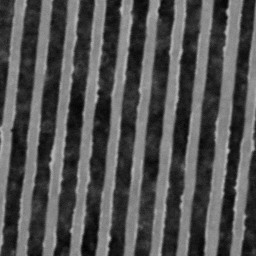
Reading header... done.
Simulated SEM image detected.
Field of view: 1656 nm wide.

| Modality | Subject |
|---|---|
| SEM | parallel lines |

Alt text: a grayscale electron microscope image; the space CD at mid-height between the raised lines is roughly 102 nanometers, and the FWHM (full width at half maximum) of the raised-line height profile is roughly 68.4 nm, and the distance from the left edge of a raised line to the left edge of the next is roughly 173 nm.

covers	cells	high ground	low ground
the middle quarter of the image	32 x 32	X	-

XX----XXX----XXX----XX----XXX---
XXX---XXX----XX-----XX----XXX---
XX----XXX----XX----XXX----XXX---
XX----XXX----XX----XXX----XXX---
XX----XX-----XX----XXX----XXX---
XX----XXX---XXX----XXX----XXX---
XX----XX----XXX----XX-----XXX---
X----XXX----XXX----XX-----XX----
X----XXX----XXX----XX-----XXX---
X----XXX----XX-----XX-----XX----
X----XXX----XX----XXX----XXX----
X----XXX----XX----XXX----XXX----
X----XXX----XX----XXX----XXX----
X----XX-----XX----XXX----XX-----
X----XX-----XX----XXX----XX-----
-----XX-----XX----XX-----XX-----
X----XX-----XX----XX-----XX----X
X----XX----XXX----XX-----XX----X
-----XX----XXX----XX-----XX----X
----XXX----XXX----XX-----XX----X
----XXX----XX-----XX----XXX----X
----XXX----XX-----XX----XXX----X
----XXX----XX-----XX----XXX----X
----XX-----XX----XXX----XXX---XX
----XX-----XX----XXX----XXX---XX
----XX-----XX----XXX----XX-----X
----XX-----XX----XX-----XX----XX
---XXX----XXX----XXX----XX-----X
---XXX----XXX----XX-----XX----XX
---XXX----XXX----XX----XXX----XX
---XXX----XXX----XX----XXX----XX
---XXX----XX-----XX----XXX----XX